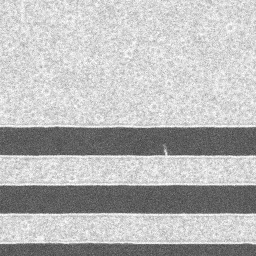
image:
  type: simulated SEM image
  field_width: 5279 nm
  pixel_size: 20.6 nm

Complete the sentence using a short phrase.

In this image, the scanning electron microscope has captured parallel lines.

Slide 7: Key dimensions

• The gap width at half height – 0.616 microns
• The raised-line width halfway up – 588 nm